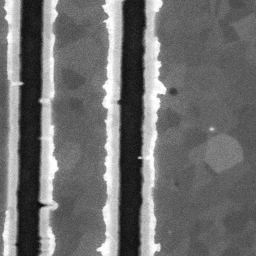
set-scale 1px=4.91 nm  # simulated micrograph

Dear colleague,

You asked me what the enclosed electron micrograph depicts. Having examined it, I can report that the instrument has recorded one or a few lines or trenches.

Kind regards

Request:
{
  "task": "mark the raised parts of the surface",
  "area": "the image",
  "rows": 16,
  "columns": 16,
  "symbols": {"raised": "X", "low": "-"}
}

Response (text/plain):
X--XXXX--XXXXXXX
X--XXXX--XXXXXXX
X--XXXX--XXXXXXX
X--XXXX--XXXXXXX
X--XXXX--XXXXXXX
X--XXXX--XXXXXXX
X--XXXX--XXXXXXX
X--XXXX--XXXXXXX
X--XXXX--XXXXXXX
X--XXXX--XXXXXXX
X--XXXX--XXXXXXX
X--XXXX--XXXXXXX
X--XXXX--XXXXXXX
X--XXXX--XXXXXXX
X--XXXX--XXXXXXX
X--XXXX--XXXXXXX